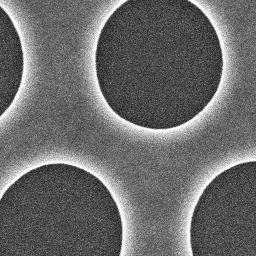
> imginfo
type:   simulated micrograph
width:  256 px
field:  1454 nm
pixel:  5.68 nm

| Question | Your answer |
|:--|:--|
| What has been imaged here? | holes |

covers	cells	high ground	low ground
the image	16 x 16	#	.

#######.....####
.######......###
.#####........##
.#####........##
.#####........##
.#####........##
.######......###
########....####
################
################
##...#########..
#.....#######...
.......#####....
........####....
........####....
........####....